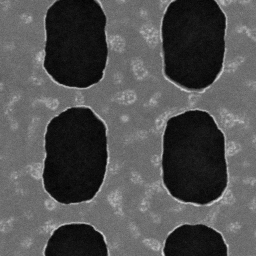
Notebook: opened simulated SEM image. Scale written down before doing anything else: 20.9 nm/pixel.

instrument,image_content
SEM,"holes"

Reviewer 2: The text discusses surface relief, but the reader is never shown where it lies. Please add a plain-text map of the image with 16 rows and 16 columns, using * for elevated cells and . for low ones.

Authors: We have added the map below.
***...*****...**
***....***....**
***....***....**
***....***....**
***...****....**
************.***
****************
***...*****..***
***....***....**
***....***....**
***....***....**
***...****....**
****.******..***
****************
***...*****...**
***....***....**